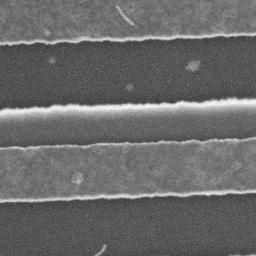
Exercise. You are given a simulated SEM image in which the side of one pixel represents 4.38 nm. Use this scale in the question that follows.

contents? lines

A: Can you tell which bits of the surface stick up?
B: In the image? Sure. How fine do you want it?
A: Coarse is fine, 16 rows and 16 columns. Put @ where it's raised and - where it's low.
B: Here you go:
@@@@@@@@@@@@@@@@
@@@@@@@@@@@@@@@@
@@@@@@-@--------
----------------
----------------
----------------
-------------@@@
@@@@@@@@@@@@@@@@
@@@@@@@@@@@@@@@@
@@@@@@@@@@@@@@@@
@@@@@@@@@@@@@@@@
@@@@@@@@@@@@@@@@
@@@@------------
----------------
----------------
----------------